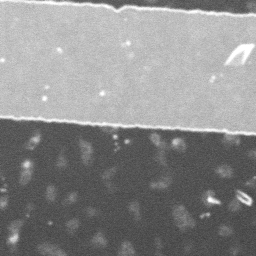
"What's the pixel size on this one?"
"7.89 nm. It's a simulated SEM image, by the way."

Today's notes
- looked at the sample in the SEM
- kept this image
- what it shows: one or a few lines or trenches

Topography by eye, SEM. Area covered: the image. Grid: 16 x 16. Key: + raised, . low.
.......+++++++++
................
................
..............+.
................
................
................
+++.............
++++++++++++++++
++++++++++++++++
++++++++++++++++
++++++++++++++++
++++++++++++++++
++++++++++++++++
++++++++++++++++
++++++++++++++++